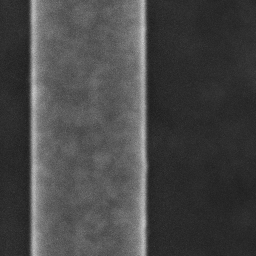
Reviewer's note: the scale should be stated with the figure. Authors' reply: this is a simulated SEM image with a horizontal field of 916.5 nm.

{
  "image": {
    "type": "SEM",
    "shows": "one or a few lines or trenches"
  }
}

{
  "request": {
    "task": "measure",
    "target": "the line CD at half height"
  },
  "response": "403 nanometres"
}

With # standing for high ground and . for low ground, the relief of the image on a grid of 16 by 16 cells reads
..#######.......
..#######.......
..#######.......
..#######.......
..#######.......
..#######.......
..#######.......
..#######.......
..#######.......
..#######.......
..#######.......
..#######.......
..#######.......
..#######.......
..#######.......
..#######.......